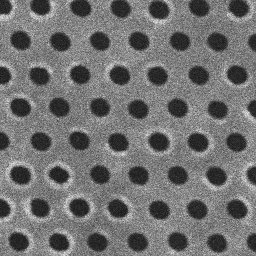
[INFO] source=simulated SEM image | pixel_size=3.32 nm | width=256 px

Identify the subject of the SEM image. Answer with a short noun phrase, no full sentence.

a regular array of holes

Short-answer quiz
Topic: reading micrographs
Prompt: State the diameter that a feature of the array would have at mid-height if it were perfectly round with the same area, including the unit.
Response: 20.1 px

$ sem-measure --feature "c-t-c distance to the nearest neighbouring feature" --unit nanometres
126